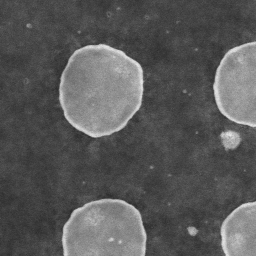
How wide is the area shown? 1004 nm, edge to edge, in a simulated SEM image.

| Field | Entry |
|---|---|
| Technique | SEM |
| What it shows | raised bodies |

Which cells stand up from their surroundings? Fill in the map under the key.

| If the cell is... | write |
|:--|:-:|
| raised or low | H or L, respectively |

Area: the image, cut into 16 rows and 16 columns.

LLLLLLLLLLLLLLLL
LLLLLLLLLLLLLLLL
LLLLLLLLLLLLLLLL
LLLLLHHHLLLLLLHH
LLLLHHHHHLLLLLHH
LLLLHHHHHLLLLHHH
LLLLHHHHHLLLLLHH
LLLLHHHHLLLLLLHH
LLLLLLLLLLLLLLLL
LLLLLLLLLLLLLLLL
LLLLLLLLLLLLLLLL
LLLLLLLLLLLLLLLL
LLLLLLHLLLLLLLLL
LLLLHHHHHLLLLLHH
LLLLHHHHHLLLLLHH
LLLLHHHHHLLLLLHH